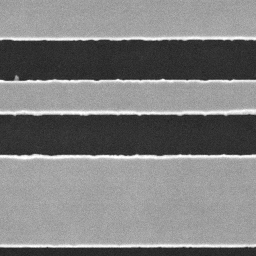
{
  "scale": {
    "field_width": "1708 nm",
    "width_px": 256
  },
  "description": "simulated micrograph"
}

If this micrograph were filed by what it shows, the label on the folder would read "lines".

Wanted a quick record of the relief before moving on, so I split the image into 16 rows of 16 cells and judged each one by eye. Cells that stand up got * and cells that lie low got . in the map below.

****************
****************
*************.**
................
................
****************
****************
................
................
................
****************
****************
****************
****************
****************
................